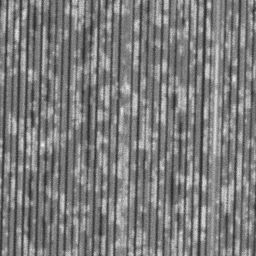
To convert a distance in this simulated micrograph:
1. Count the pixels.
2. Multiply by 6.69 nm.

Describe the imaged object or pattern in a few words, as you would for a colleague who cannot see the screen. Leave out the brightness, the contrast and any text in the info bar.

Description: parallel lines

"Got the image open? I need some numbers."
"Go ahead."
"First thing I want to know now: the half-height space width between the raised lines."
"0.0134 microns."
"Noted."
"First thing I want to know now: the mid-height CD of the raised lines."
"32.6 nm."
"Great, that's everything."